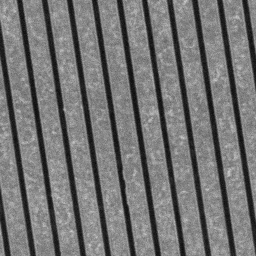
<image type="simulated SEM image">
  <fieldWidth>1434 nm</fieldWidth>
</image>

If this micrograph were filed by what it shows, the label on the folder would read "parallel lines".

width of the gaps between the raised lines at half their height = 0.0352 µm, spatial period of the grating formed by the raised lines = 138 nanometers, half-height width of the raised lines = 102 nanometers